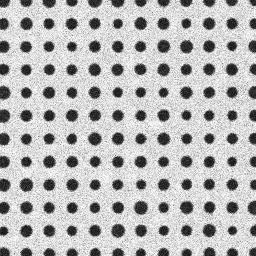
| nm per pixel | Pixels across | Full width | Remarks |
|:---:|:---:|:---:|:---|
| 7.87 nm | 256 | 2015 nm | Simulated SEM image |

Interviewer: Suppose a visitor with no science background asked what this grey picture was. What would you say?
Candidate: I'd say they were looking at a regular array of holes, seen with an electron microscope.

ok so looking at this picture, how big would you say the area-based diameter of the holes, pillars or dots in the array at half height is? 93.4 nanometres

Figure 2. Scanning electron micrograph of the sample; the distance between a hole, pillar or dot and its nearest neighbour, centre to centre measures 178 nanometers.